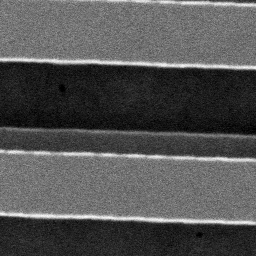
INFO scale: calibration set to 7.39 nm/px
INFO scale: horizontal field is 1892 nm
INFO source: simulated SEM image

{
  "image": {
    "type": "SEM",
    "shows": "lines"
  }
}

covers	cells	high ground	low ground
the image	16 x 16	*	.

****************
****************
****************
****************
................
................
................
................
***************.
****************
****************
****************
****************
.***************
................
................